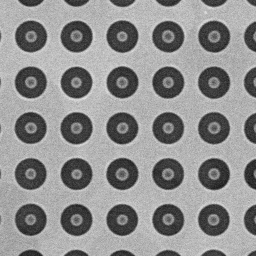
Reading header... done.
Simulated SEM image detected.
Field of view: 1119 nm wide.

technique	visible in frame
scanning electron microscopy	an array of small figures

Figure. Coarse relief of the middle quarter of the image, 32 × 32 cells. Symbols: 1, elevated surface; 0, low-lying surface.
11111111111111011111111111111111
10000011111100000111111000000111
00000001111000000011111000000011
00000001111000100001110000000011
00110001111001110001110001100011
00110001111000100001110001100011
00000001111000000011110000000011
00000011111100000111111000000111
11000111111110001111111110011111
11111111111111111111111111111111
11111111111111111111111111111111
11111111111111111111111111111111
10000111111110001111111100001111
00000011111000000011111000000111
00000001111000000011110000000011
00110001110001110001110001100011
00110001110001110001110001100011
00000001111000000011110000000011
00000011111000000011111000000111
10000111111100000111111100001111
11111111111111111111111111111111
11111111111111111111111111111111
11111111111111111111111111111111
11001111111111001111111110011111
00000011111100000111111000000111
00000001111000000011110000000111
00010001111000100011110001100011
00110001110001110001110001100011
00010001111001110011110001100011
00000001111000000011111000000011
00000011111100000111111000000111
11001111111111011111111110011111